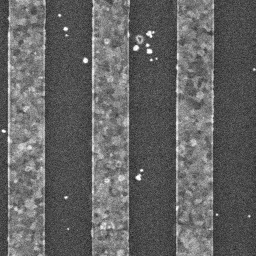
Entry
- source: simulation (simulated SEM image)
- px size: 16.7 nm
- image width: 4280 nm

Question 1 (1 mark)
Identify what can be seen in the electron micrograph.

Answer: lines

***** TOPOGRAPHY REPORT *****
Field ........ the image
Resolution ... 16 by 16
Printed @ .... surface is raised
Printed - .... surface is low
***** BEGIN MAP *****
-@@---@@---@@---
-@@---@@---@@---
-@@---@@---@@---
-@@---@@---@@---
-@@---@@---@@---
-@@---@@---@@---
-@@---@@---@@---
-@@---@@---@@---
-@@---@@---@@---
-@@---@@---@@---
-@@---@@---@@---
-@@---@@---@@---
-@@---@@---@@---
-@@---@@---@@---
-@@---@@---@@---
-@@---@@---@@---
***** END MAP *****